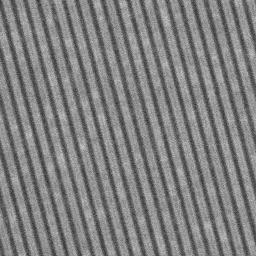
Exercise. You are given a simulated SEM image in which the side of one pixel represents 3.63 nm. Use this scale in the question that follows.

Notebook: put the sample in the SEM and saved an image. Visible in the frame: parallel lines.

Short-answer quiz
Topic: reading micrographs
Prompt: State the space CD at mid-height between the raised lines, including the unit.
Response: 18.9 nanometres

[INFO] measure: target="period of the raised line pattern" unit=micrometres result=0.0452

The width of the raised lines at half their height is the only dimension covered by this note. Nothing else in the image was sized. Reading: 25 nm